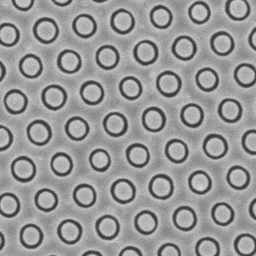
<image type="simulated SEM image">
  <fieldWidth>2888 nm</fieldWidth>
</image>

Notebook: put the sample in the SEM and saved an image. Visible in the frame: a regular array of ring-shaped grooves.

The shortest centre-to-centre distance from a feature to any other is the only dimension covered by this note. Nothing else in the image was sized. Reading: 430 nanometers